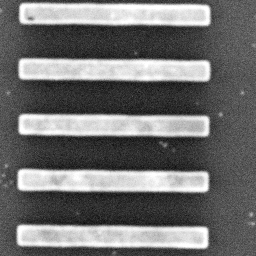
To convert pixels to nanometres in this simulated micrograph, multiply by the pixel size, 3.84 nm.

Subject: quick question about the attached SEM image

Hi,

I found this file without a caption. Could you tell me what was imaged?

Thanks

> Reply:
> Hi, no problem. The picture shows groups of lines, slits or small figures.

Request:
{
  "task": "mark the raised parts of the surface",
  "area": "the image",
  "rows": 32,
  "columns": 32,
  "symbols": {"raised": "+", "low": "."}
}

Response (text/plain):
................................
...+++++++++++++++++++++++......
...+++++++++++++++++++++++......
................................
................................
................................
................................
................................
...+++++++++++++++++++++++......
...+++++++++++++++++++++++......
................................
................................
................................
................................
................................
...+++++++++++++++++++++++......
...+++++++++++++++++++++++......
................................
................................
................................
................................
...++++++++++...................
..++++++++++++++++++++++++......
...+++++++++++++++++++++++......
................................
................................
................................
................................
...++++++++++++++...............
..++++++++++++++++++++++++......
...+++++++++++++++++++++++......
................................